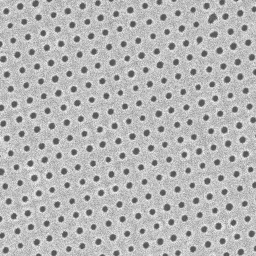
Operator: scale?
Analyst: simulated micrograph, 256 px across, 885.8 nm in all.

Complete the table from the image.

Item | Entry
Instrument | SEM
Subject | a regular array of holes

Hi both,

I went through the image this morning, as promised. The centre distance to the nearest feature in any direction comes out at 0.0505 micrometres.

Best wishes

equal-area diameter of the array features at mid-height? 20.6 nanometres